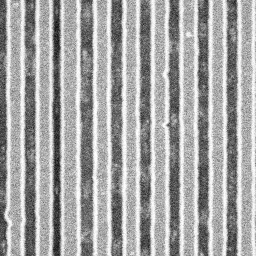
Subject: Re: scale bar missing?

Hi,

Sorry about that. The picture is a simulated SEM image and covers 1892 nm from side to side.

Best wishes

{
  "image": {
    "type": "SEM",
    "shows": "parallel lines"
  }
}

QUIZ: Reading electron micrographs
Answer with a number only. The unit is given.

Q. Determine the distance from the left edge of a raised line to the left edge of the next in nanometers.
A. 214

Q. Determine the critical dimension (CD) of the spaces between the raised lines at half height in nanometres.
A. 98.8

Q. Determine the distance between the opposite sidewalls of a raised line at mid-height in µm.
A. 0.113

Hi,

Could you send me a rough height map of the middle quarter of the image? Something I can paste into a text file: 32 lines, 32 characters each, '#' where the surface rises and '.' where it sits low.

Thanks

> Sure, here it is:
####....###....####...####...###
####....###....####...####...###
####....###....####...###....###
####....###....####...####...###
####....###....####...####...###
####....###....####...####...###
####....###....####...####...###
####....###....####...####...###
####....###....####...####...###
####....###....####...####...###
####....###....####...####...###
####....###....####...####...###
####....###....####...####...###
####....###....####...####...###
####....###....####...####...###
####....###....####...###....###
####....###....####...####...###
####....###....####...####...###
####....###....####...####...###
####....###....####...####...###
####....###....####...####...###
####....###....####...####...###
####....###....####...####...###
####....###....####...####...###
####....###....####...####...###
####....###....####...####...###
####....###....####...####...###
####....###....####...####...###
####....###....####...####...###
####....###....####...####...###
####....###....####...####...###
####....###....####...####...###